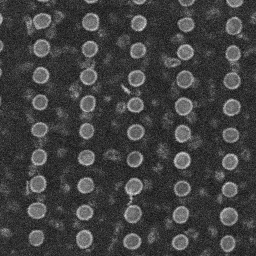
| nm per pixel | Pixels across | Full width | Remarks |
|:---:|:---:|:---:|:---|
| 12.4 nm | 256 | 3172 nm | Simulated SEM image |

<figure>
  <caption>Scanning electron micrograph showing a regular array of raised bodies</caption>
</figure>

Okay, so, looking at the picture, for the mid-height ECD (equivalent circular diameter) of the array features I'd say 184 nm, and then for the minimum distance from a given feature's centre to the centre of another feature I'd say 332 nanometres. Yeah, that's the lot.